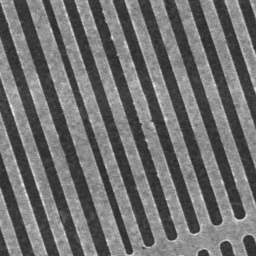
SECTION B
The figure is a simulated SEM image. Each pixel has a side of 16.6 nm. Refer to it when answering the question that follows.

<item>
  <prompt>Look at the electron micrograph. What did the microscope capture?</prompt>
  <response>parallel lines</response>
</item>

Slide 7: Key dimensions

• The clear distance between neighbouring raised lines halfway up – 197 nm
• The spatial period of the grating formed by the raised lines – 393 nm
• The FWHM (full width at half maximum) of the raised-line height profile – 197 nm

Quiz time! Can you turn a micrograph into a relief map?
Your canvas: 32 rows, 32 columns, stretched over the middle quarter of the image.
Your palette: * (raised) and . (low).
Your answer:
..***...***...***....***...***..
..***...****...***...***...***..
*..***...***...***...****...***.
*..***...***...***....***...***.
*..***...****...***...***...***.
**..***...***...***...****...***
**..***...***...***....***...***
**..***...****...***...***...***
***..***...***...***...****...**
***..***...***...****...***...**
***..***...****...***...***...**
*****.***...***...***...****...*
*****.***...***...***....***...*
****..***...****...***...***...*
.****..***...***...***...****...
.****..***...***....**....***...
.****..***...****...***...***...
..****..***...***...***...****..
..****..***...***...***....***..
..****..***...****...***...***..
...****..***...***...***...****.
...****..***...***...***....***.
...****..***...****...***...***.
....****..***...***...***...***.
*...****..***...***...***....***
*...****..***...****...***...***
*....****..***...***...***...***
**...****..***...***...***....**
**...****..***...****...***...**
**....****..***...***...***...**
***...****..***...***...***....*
***...****..***...****...***...*